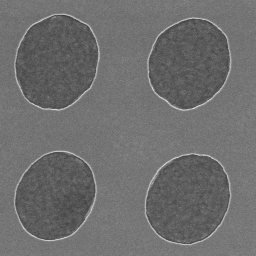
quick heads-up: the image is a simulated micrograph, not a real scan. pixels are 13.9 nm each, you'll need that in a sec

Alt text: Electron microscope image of holes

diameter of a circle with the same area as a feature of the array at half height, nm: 1120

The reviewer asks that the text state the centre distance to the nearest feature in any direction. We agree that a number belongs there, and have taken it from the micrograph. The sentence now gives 1840 nm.